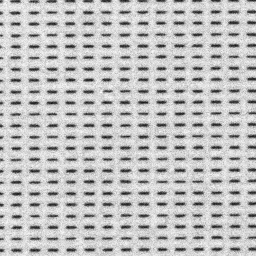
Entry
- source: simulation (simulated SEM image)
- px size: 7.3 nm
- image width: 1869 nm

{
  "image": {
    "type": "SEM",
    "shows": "a regular array of holes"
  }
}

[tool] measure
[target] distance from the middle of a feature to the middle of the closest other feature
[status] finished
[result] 80.8 nm